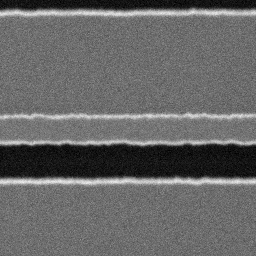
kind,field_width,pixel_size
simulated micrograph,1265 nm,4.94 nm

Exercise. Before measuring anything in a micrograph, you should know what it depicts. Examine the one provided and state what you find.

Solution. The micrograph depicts lines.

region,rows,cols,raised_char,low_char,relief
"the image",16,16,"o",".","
................
oooooooooooooooo
oooooooooooooooo
oooooooooooooooo
oooooooooooooooo
oooooooooooooooo
oooooooooooooooo
oooooooooooooooo
oooooooooooooooo
................
................
oooooooooooooooo
oooooooooooooooo
oooooooooooooooo
oooooooooooooooo
oooooooooooooooo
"